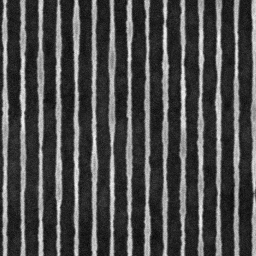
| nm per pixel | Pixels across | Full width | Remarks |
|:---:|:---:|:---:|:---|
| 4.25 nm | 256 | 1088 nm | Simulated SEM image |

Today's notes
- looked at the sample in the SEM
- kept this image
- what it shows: parallel lines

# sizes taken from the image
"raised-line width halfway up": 14.3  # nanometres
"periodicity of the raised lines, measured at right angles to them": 75.7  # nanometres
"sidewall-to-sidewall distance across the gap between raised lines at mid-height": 0.0611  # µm